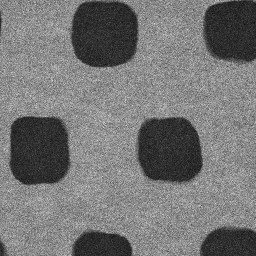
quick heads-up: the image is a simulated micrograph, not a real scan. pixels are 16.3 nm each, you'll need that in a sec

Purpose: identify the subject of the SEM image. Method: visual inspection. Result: holes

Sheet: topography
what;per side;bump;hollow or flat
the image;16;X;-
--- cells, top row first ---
XXXXX---XXXXX---
XXXXX----XXXX---
XXXXX----XXXX---
XXXXX---XXXXX---
XXXXXXXXXXXXXXXX
XXXXXXXXXXXXXXXX
XXXXXXXXXXXXXXXX
X---XXXXX---XXXX
X---XXXXX---XXXX
X---XXXXX----XXX
X---XXXXX----XXX
XXXXXXXXXXXXXXXX
XXXXXXXXXXXXXXXX
XXXXXXXXXXXXXXXX
XXXXX-XXXXXXX---
XXXXX---XXXXX---